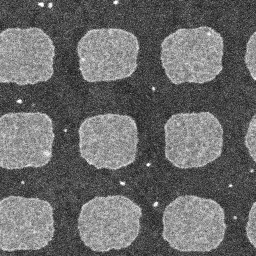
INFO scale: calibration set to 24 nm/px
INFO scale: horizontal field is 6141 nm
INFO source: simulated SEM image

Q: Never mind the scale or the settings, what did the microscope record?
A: raised bodies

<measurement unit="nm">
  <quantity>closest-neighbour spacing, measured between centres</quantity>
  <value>2030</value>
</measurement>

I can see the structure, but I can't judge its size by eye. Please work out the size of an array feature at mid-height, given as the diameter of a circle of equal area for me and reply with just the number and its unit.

1340 nanometres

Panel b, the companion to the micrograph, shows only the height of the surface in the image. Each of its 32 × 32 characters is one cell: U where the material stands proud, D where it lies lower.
DDDDDDDDDDDDDDDDDDDDDDDDDDDDDDDD
DDDDDDDDDDDDDDDDDDDDDDDDDDDDDDDD
DDDDDDDDDDDDDDDDDDDDDDDDDDDDDDDD
DDDDDDDDDDDDDDDDDDDDDDDDDDDDDDDD
UUUUUUDDDDDUUUUUUDDDDUUUUUUDDDDD
UUUUUUDDDDUUUUUUUDDDUUUUUUUUDDDU
UUUUUUUDDDUUUUUUUDDDUUUUUUUUDDDU
UDUUUUDDDDUUUUUUUDDDUUUUUUUUDDDU
UUUUUUDDDDUUUUUUUDDDDUUUUUUUDDDU
UUUUUUDDDDDUUUUUDDDDDUUUUUUDDDDD
DDDDDDDDDDDDDDDDDDDDDDDDDDDDDDDD
DDDDDDDDDDDDDDDDDDDDDDDDDDDDDDDD
DDDDDDDDDDDDDDDDDDDDDDDDDDDDDDDD
DDDDDDDDDDDDDDDDDDDDDDDDDDDDDDDD
DUUUUUDDDDDDDUUDDDDDDDUUUUUDDDDD
UUUUUUDDDDUUUUUUUDDDDUUUUUUDDDDU
UUUUUUDDDDUUUUUUUDDDDUUUUUUUDDDU
UUUUUUUDDDUUUUUUUDDDDUUUUUUUDDDU
UUUUUUDDDDUUUUUUUDDDDUUUUUUUDDDU
UUUDUUDDDDUUUUUUUDDDDUUUUUUDDDDD
UUDUUUDDDDDDUUUUDDDDDDUUUUDDDDDD
DDDDDDDDDDDDDDDDDDDDDDDDDDDDDDDD
DDDDDDDDDDDDDDDDDDDDDDDDDDDDDDDD
DDDDDDDDDDDDDDDDDDDDDDDDDDDDDDDD
DDDDDDDDDDDDDDDDDDDDDDDDDDDDDDDD
UUUUUUDDDDDUUUUUUDDDDDUUUUUDDDDD
UUUUUUDDDDUUUUUUUDDDDUUUUUUUDDDU
UUUUUUUDDDUUUUUUUDDDUUUUUUUUDDDU
UUUUUUUDDDUUUUUUUDDDDUUUUUUUDDDU
UUUUUUDDDDUUUUUUUDDDUUUUUUUUDDDU
UUUUUUDDDDDUUUUUDDDDDUUUUUUDDDDD
DDDDDDDDDDDDDDDDDDDDDDDDDDDDDDDD